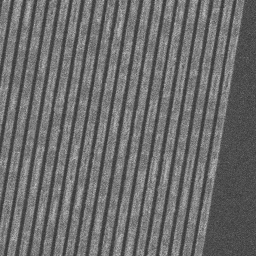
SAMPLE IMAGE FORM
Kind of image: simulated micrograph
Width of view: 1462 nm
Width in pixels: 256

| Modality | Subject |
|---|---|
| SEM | parallel lines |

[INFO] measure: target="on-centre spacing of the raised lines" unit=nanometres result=65.9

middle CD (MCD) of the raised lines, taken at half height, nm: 46.5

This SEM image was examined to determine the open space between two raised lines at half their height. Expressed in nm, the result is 21.1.